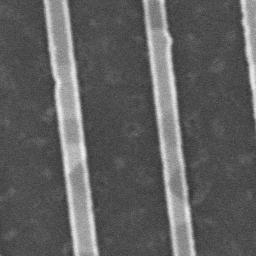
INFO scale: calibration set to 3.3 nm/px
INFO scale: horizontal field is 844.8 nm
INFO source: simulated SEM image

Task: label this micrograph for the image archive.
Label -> one or a few lines or trenches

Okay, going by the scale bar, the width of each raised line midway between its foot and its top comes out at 61.1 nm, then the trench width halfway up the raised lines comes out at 78.9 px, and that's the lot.